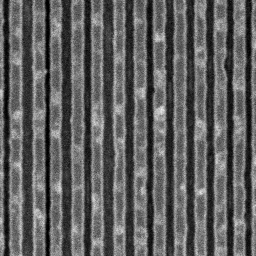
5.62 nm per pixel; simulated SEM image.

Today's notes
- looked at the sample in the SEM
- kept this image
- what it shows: parallel lines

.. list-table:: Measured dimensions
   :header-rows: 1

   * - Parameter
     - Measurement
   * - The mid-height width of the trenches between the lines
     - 0.0499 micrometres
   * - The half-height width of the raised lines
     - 0.0646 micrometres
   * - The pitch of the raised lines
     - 0.114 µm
